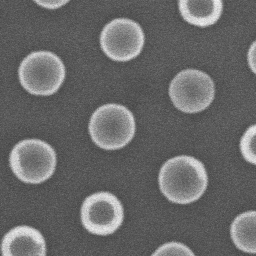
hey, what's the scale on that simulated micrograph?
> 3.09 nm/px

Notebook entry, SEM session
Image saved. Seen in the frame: raised bodies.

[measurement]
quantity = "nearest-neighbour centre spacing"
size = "268 nanometres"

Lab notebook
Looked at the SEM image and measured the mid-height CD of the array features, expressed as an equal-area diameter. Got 132 nm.